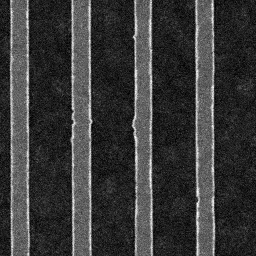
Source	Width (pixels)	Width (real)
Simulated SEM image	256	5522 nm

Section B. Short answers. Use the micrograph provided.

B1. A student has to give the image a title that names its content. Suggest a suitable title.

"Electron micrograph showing one or a few lines or trenches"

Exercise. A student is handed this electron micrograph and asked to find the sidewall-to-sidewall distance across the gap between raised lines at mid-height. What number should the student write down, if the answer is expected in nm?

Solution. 968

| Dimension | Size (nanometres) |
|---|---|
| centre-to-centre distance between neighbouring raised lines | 1330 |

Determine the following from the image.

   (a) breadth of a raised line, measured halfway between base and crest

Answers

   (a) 357 nm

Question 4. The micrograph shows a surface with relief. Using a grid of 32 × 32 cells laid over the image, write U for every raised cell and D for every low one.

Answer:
DUUUDDDDDUUDDDDDDUUDDDDDDUUDDDDD
DUUDDDDDDUUDDDDDDUUDDDDDDUUDDDDD
DUUDDDDDDUUDDDDDDUUDDDDDDUUDDDDD
DUUUDDDDDUUDDDDDDUUDDDDDDUUDDDDD
DUUUDDDDDUUDDDDDDUUDDDDDDUUDDDDD
DUUUDDDDDUUDDDDDDUUDDDDDDUUDDDDD
DUUUDDDDDUUDDDDDDUUDDDDDDUUDDDDD
DUUDDDDDDUUDDDDDDUUDDDDDDUUDDDDD
DUUDDDDDDUUDDDDDDUUDDDDDDUUDDDDD
DUUUDDDDDUUDDDDDDUUDDDDDDUUDDDDD
DUUUDDDDDUUDDDDDDUUDDDDDDUUDDDDD
DUUDDDDDDUUDDDDDDUUDDDDDDUUDDDDD
DUUDDDDDDUUDDDDDDUUDDDDDDUUDDDDD
DUUDDDDDDUUDDDDDDUUDDDDDDUUDDDDD
DUUDDDDDDUUDDDDDDUUDDDDDDUUDDDDD
DUUDDDDDDUUDDDDDDUUDDDDDDUUDDDDD
DUUDDDDDDUUDDDDDDUUDDDDDDUUDDDDD
DUUDDDDDDUUDDDDDDUUDDDDDDUUDDDDD
DUUDDDDDDUUDDDDDDUUDDDDDDUUDDDDD
DUUDDDDDDUUDDDDDDUUDDDDDDUUDDDDD
DDUDDDDDDUUDDDDDDUUDDDDDDUUDDDDD
DDUDDDDDDUUDDDDDDUUDDDDDDUUDDDDD
DDUDDDDDDUUDDDDDDUUDDDDDDUUDDDDD
DDUDDDDDDUUDDDDDDUUDDDDDDUUDDDDD
DDUDDDDDDUUDDDDDDUUDDDDDDUUDDDDD
DUUDDDDDDUUDDDDDDUUDDDDDDUUDDDDD
DUUDDDDDDUUDDDDDDUUDDDDDDUUDDDDD
DDUDDDDDDUUDDDDDDUUDDDDDDUUDDDDD
DDUUDDDDDUUDDDDDDUUDDDDDDUUDDDDD
DDUUDDDDDUUDDDDDDUUDDDDDDUUDDDDD
DDUUDDDDDUUDDDDDDUUDDDDDDUUDDDDD
DDUUDDDDDUUDDDDDDUUDDDDDDUUDDDDD